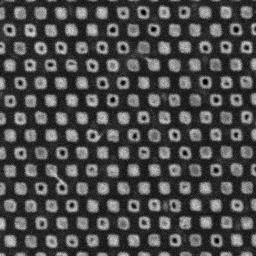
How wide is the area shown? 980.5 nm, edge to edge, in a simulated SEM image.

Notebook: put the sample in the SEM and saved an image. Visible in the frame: a regular array of raised bodies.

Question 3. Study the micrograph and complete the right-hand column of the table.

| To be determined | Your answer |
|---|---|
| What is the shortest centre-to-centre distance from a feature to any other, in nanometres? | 76.3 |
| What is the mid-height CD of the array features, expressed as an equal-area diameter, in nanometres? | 44.3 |